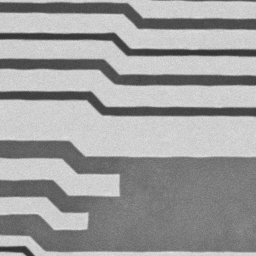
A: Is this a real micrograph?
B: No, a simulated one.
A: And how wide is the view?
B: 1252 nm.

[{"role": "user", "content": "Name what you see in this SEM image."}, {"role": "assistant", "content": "groups of lines, slits or small figures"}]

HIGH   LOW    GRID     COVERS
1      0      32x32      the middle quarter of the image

00000000000011111111111111111111
00111111100001111111111111111111
11111111110000110000111110011111
11111111111000000000000000000000
11111111111100000000000000000000
11111111111111111100111111111111
11111111111111111111111111111111
00000001111111111111111111111111
00000000111111111111111111111111
11111100011111111111111111111111
11111110001111111111111111111111
11111111000000000000000000000000
11111111100000000000000000000000
11111111111111111111111111111111
11111111111111111111111111111111
11111111111111111111111111111111
11111111111111111111111111111111
11111111111111111111111111111111
11111111111111111111111111111111
00111111111111111111111111111111
00011111111111111111111111111111
00001111111111111111111111111111
00000111111111111111111111111111
00000000000000000000000000000000
00000000000000000000000000000000
10000000000000000000000000000000
11000000000000000000000000000000
11110000000000000000000000000000
11111111111111000000000000000000
11111111111111000000000000000000
11111111111111000000000000000000
11111111111111000000000000000000